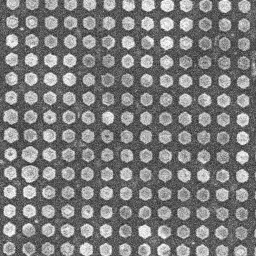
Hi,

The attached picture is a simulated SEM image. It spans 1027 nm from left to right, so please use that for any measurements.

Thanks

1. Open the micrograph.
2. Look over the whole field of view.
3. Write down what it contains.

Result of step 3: a regular array of raised bodies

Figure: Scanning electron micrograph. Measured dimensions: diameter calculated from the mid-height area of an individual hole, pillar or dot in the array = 47.9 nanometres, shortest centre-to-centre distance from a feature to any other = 0.0751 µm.